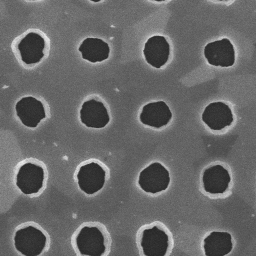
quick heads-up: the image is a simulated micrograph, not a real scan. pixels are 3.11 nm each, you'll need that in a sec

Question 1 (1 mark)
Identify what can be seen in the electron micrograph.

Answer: a regular array of holes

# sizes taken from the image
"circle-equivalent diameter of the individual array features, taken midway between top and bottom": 93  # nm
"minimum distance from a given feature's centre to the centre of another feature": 0.193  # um